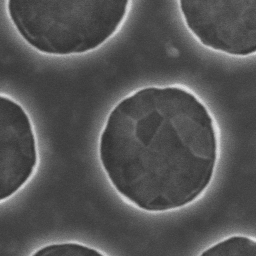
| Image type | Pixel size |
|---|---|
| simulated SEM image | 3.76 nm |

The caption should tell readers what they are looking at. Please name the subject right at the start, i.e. holes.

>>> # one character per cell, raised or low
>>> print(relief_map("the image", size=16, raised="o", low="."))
........ooo.....
o......ooooo....
oo.....ooooo....
oooooooooooooooo
oooooooooooooooo
oooooooooooooooo
.oooooo......ooo
..ooooo......ooo
..oooo........oo
..oooo........oo
..ooooo......ooo
.oooooo......ooo
oooooooo....oooo
oooooooooooooooo
oooooooooooooooo
ooo...ooooooo...